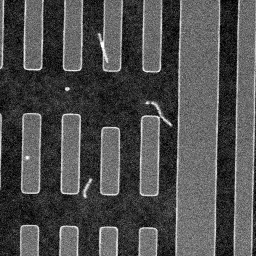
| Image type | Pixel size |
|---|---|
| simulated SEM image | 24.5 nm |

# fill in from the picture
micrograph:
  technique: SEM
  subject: groups of lines, slits or small figures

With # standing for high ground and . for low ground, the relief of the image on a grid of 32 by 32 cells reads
...##...##...##...##...####...##
...##...##...##...##...####...##
...##...##...##...##...####...##
...##...##...##...##...####...##
...##...##...##...##...####...##
...##...##...##...##...####...##
...##...##...##...##..#####...##
...##...##...##...##..#####...##
...##...##...##...##..#####...##
......................#####...##
......................#####...##
......................#####...##
......................#####...##
......................#####...##
...##...##........#...#####...##
...##...##........##..#####...##
...##...##...##...##..#####...##
...##...##...##...##..#####...##
...##...##...##...##..#####...##
...##...##...##...##..#####...##
...##...##...##...##..#####...##
...##...##...##...##..#####..###
...##...##...##...##..#####..###
...##...##...##...##..#####..###
......................#####..###
......................#####..###
......................#####..###
......................#####..###
...##...##...#....#...#####..###
...##...##...##..###..#####..###
...##...##...##..###..#####..##.
...##...##...##..###..#####..##.